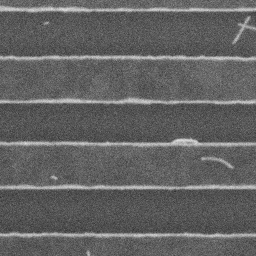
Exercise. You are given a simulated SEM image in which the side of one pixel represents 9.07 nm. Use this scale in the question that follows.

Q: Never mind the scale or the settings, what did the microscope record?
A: lines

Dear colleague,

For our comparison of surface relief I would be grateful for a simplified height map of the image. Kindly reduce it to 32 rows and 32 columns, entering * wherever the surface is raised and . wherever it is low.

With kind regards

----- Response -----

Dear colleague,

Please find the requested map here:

********************************
................................
................................
................................
................................
................................
................................
********************************
********************************
********************************
********************************
********************************
********************************
................................
................................
................................
................................
................................
********************************
********************************
********************************
********************************
********************************
.....................***........
................................
................................
................................
................................
................................
********************************
********************************
********************************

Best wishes